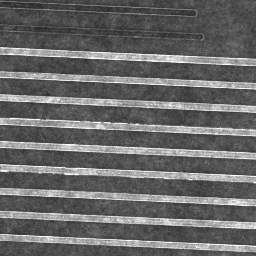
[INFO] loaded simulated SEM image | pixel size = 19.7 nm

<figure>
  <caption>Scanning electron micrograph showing parallel lines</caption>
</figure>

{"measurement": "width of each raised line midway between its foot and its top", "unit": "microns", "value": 0.13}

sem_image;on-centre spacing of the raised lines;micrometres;0.458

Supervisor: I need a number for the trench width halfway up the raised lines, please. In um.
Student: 0.337